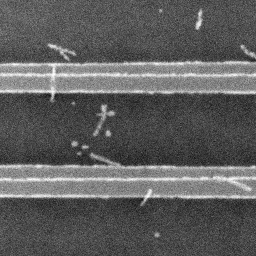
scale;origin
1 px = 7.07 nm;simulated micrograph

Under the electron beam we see lines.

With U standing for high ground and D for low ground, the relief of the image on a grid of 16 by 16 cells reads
DDDDDDDDDDDDDDDD
DDDDDDDDDDDDDDDD
DDDDDDDDDDDDDDDD
DDDDDDDDDDDDDDDD
UUUUUUUUUUUUUUUU
UUUUUUUUUUUUUUUU
DDDDDDDDDDDDDDDD
DDDDDDDDDDDDDDDD
DDDDDDDDDDDDDDDD
DDDDDDDDDDDDDDDD
UUUUUUUUUUUUUUUU
UUUUUUUUUUUUUUUU
DDDDDDDDDDDDDDDD
DDDDDDDDDDDDDDDD
DDDDDDDDDDDDDDDD
DDDDDDDDDDDDDDDD